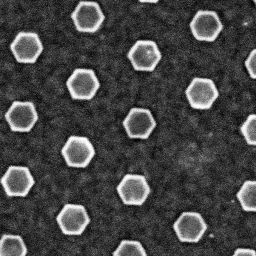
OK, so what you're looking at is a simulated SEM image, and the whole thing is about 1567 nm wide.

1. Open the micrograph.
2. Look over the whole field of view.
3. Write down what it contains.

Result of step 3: a regular array of raised bodies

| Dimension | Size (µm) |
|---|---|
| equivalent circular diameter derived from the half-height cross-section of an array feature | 0.174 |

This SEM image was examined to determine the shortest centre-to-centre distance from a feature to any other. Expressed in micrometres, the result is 0.411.